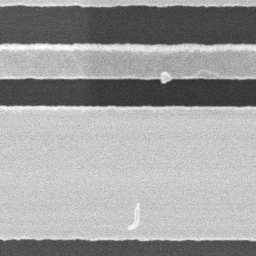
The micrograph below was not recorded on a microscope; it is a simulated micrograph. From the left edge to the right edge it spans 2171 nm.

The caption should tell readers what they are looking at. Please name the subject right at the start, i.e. lines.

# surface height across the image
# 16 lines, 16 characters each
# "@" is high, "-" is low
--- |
----------------
----------------
----------------
@@@@@@@@@@@@@@@@
@@@@@@@@@@@@@@@@
----------------
----------------
@@@@@@@@@@@@@@@@
@@@@@@@@@@@@@@@@
@@@@@@@@@@@@@@@@
@@@@@@@@@@@@@@@@
@@@@@@@@@@@@@@@@
@@@@@@@@@@@@@@@@
@@@@@@@@@@@@@@@@
@@@@@@@@@@@@@@@@
----------------